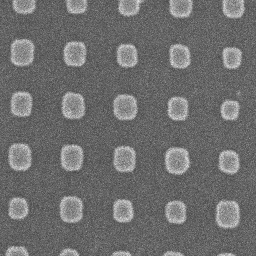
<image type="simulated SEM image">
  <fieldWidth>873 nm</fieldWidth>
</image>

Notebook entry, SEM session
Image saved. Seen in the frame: a regular array of raised bodies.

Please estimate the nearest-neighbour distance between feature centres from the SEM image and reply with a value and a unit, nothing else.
176 nm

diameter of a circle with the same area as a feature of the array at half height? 0.0798 µm